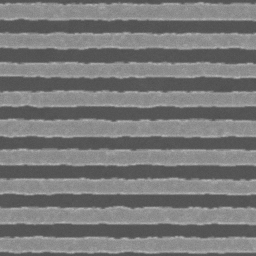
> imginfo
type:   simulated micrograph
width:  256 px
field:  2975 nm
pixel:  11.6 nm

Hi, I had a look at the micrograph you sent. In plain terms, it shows wiring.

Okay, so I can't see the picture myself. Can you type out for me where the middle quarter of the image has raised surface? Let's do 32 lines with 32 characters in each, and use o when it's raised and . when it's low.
oooooooooooooooooooooooooooooooo
oooooooooooooooooooooooooooooooo
oooooooooooooooooooooooooooooooo
................................
................................
................................
................................
oooooooooooooooooooooooooooooooo
oooooooooooooooooooooooooooooooo
oooooooooooooooooooooooooooooooo
................................
................................
................................
................................
ooooooooooo........oo..oooooo.oo
oooooooooooooooooooooooooooooooo
oooooooooooooooooooooooooooooooo
oooooooooooooooooooooooooooooooo
................................
................................
................................
................................
oooooooooooooooooooooooooooooooo
oooooooooooooooooooooooooooooooo
oooooooooooooooooooooooooooooooo
................................
................................
................................
................................
oooooooooooooooooooooooooooooooo
oooooooooooooooooooooooooooooooo
oooooooooooooooooooooooooooooooo